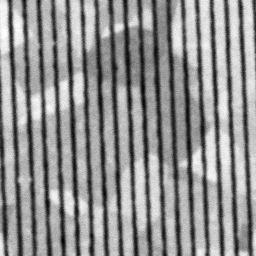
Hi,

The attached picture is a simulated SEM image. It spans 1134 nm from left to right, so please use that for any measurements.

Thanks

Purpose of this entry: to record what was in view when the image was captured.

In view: parallel lines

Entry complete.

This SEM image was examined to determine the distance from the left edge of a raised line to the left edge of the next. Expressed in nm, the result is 63.7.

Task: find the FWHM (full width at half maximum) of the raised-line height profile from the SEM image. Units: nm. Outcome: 38.7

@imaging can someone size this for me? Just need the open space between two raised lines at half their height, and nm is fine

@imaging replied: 27.1